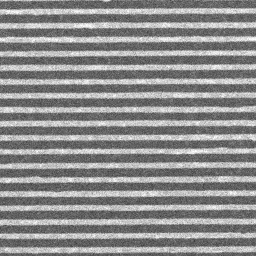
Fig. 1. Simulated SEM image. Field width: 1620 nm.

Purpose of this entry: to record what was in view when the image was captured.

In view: parallel lines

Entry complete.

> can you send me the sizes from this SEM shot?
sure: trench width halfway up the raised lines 58.5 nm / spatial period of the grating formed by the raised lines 0.0887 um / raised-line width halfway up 30.8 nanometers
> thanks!